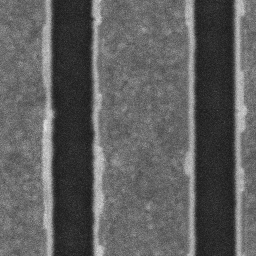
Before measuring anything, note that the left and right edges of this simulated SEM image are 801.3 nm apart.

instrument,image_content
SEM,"one or a few lines or trenches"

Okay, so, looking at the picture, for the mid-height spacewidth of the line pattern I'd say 144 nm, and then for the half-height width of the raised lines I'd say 0.3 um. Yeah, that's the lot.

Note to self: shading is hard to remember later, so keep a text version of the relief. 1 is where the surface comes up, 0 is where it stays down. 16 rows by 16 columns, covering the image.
1110001111110001
1110001111110001
1110001111110001
1110001111110001
1110001111110001
1110001111110001
1110001111110001
1110001111110001
1110001111110001
1110001111110001
1110001111110001
1110001111110001
1110001111110001
1110001111110001
1110001111110001
1110001111110001